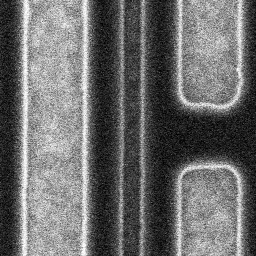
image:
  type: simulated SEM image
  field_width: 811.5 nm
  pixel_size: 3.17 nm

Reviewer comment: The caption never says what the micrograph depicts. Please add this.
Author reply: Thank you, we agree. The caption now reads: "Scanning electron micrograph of one or a few lines or trenches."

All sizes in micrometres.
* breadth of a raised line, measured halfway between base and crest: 0.125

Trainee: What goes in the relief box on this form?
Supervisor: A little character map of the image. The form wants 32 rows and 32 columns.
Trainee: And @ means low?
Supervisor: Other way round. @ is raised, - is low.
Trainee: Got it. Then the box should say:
@@@--------@@@@---@@@@@-------@@
@@@--------@@@@---@@@@@-------@@
@@@--------@@@@---@@@@@-------@@
@@@--------@@@@---@@@@@-------@@
@@@--------@@@@---@@@@@-------@@
@@@--------@@@@---@@@@@-------@@
@@@--------@@@@---@@@@@-------@@
@@@--------@@@@---@@@@@-------@@
@@@--------@@@@---@@@@@-------@@
@@@--------@@@@---@@@@@-------@@
@@@--------@@@@---@@@@@-------@@
@@@--------@@@@---@@@@@-------@@
@@@--------@@@@---@@@@@------@@@
@@@--------@@@@---@@@@@@@@@@@@@@
@@@--------@@@@---@@@@@@@@@@@@@@
@@@--------@@@@---@@@@@@@@@@@@@@
@@@--------@@@@---@@@@@@@@@@@@@@
@@@--------@@@@---@@@@@@@@@@@@@@
@@@--------@@@@---@@@@@@@@@@@@@@
@@@--------@@@@---@@@@@@@@@@@@@@
@@@--------@@@@---@@@@@@@@@@@@@@
@@@--------@@@@---@@@@@------@@@
@@@--------@@@@---@@@@@-------@@
@@@--------@@@@---@@@@@-------@@
@@@--------@@@@---@@@@@-------@@
@@@--------@@@@---@@@@@-------@@
@@@--------@@@@---@@@@@-------@@
@@@--------@@@@---@@@@--------@@
@@@-------@@@@@---@@@@--------@@
@@@-------@@@@@---@@@@--------@@
@@@-------@@@@@---@@@@--------@@
@@@-------@@@@@---@@@@--------@@